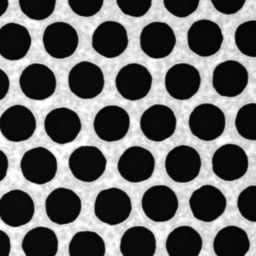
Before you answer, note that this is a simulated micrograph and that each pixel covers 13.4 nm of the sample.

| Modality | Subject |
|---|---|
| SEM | a regular array of holes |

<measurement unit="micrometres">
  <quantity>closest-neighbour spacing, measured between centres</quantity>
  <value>0.626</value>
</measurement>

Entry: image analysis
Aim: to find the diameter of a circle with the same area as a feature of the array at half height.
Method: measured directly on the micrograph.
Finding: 36.8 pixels